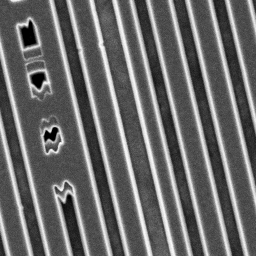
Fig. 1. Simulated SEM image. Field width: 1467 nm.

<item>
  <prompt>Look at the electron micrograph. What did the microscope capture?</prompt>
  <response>parallel lines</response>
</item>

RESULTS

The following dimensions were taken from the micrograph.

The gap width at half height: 0.0859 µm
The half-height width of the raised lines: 137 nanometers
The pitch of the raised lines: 221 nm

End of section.